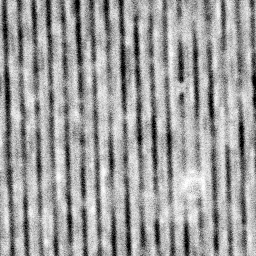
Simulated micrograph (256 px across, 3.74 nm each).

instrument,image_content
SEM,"parallel lines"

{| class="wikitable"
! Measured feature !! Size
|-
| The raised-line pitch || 54.4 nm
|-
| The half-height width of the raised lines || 31.3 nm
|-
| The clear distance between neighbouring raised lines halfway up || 0.0243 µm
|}